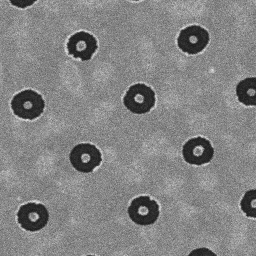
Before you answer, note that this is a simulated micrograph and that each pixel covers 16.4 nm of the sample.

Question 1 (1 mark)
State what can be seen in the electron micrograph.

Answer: a regular array of ring-shaped grooves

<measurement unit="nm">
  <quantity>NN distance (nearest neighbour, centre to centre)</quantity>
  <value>1280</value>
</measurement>